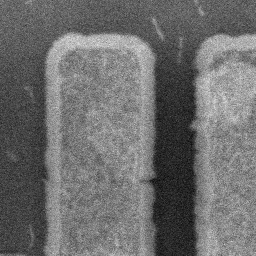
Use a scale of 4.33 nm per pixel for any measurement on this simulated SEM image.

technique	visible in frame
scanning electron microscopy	one or a few lines or trenches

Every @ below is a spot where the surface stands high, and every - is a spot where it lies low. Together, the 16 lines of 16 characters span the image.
----------------
----------------
----------------
----@@@@@----@@@
---@@@@@@----@@@
---@@@@@@----@@@
---@@@@@@----@@@
---@@@@@@----@@@
---@@@@@@----@@@
---@@@@@@----@@@
---@@@@@@----@@@
---@@@@@@----@@@
---@@@@@@----@@@
---@@@@@@----@@@
---@@@@@@----@@@
---@@@@@@----@@@